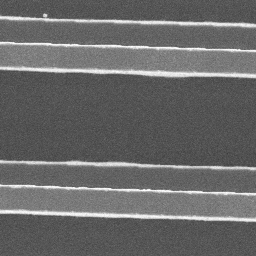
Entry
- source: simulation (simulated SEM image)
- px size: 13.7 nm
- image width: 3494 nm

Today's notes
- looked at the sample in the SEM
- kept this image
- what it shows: lines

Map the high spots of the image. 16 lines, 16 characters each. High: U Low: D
DDDDDDDDDDDDDDDD
UUUUUUUUUUUUDDDD
UUUUUUUUUUUUUUUU
UUUUUUUUUUUUUUUU
DDDDDDDDDUUUUUUU
DDDDDDDDDDDDDDDD
DDDDDDDDDDDDDDDD
DDDDDDDDDDDDDDDD
DDDDDDDDDDDDDDDD
DDDDDDDDDDDDDDDD
UUUUUUUUUUUUUUDD
UUUUUUUUUUUUUUUU
UUUUUUUUUUUUUUUU
DDDDDDDDDUUUUUUU
DDDDDDDDDDDDDDDD
DDDDDDDDDDDDDDDD